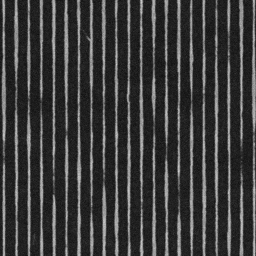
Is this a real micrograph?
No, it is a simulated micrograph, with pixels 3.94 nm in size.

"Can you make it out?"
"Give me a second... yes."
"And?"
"parallel lines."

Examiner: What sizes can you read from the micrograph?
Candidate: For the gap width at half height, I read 40.9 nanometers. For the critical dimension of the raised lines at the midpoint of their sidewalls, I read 8.4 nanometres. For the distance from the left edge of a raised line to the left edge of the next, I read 0.0492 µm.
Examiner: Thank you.